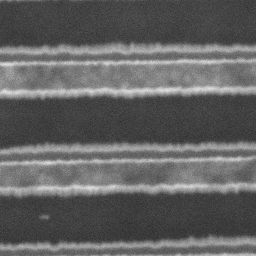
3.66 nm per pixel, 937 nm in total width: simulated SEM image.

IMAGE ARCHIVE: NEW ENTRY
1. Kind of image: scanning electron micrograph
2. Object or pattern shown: lines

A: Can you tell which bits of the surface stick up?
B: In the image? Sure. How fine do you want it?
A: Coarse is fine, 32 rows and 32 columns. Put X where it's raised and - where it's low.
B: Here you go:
--------------------------------
--------------------------------
--------------------------------
--------------------------------
--------------------------------
--------------------------------
--X--X-XX-X-XXXXXXXXXXXXXXXXXXXX
XXXXXXXXXXXXXXXXXXXXXXXXXXXXXXXX
XXXXXXXXXXXXXXXXXXXXXXXXXXXXXXXX
XXXXXXXXXXXXXXXXXXXXXXXXXXXXXXXX
XXXXXXXXXXXXXXXXXXXXXXXXXXXXXXXX
XXXXXXXXXX-X--XXX---------------
--------------------------------
--------------------------------
--------------------------------
--------------------------------
--------------------------------
--------------------------------
-------------------------XXXXXXX
XXXXXXXXXXXXXXXXXXXXXXXXXXXXXXXX
XXXXXXXXXXXXXXXXXXXXXXXXXXXXXXXX
XXXXXXXXXXXXXXXXXXXXXXXXXXXXXXXX
XXXXXXXXXXXXXXXXXXXXXXXXXXXXXXXX
XXXXXXXXXXXXXX-XX-XX-X----------
--------------------------------
--------------------------------
--------------------------------
--------------------------------
--------------------------------
--------------------------------
--------------------------XX-XXX
XXXXXXXXXXXXXXXXXXXXXXXXXXXXXXXX